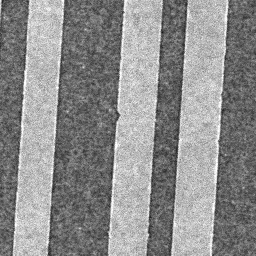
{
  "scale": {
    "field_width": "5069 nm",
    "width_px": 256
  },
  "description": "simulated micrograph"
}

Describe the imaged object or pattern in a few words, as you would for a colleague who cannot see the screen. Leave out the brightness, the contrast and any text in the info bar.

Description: one or a few lines or trenches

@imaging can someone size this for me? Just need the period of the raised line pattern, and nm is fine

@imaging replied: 1590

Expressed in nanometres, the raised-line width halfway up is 741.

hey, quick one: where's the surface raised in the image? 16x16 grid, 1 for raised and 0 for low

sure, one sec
0011000011001100
0011000011001100
0011000011001100
0011000011001100
0011000011011100
0011000111011100
0111000111011100
0110000111011100
0110000111011100
0110000111011100
0110000110011100
0110000110011000
0110000110011000
0110000110011000
0110000110011000
0110000110011000